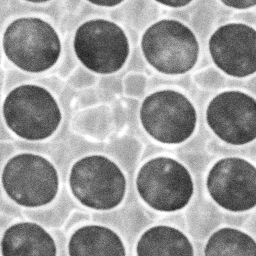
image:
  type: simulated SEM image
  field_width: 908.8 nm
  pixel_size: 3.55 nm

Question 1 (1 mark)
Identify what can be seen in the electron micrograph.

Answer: a regular array of holes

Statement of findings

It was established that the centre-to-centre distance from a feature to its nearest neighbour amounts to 0.24 um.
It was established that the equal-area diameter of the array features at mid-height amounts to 199 nanometres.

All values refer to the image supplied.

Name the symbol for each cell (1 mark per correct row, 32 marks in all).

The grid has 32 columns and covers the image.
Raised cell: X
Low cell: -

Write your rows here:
XXXXXXXXXXXX---XXXXX---XXXXX----
XXXXXXXXXXXXXXXXXXXXXXXXXXXXXXXX
XX----XXXXX--XXXXXXX--XXXXXXXXXX
X------XXX-----XXX------XXX----X
-------XX-------XX------XX------
--------X-------XX-------X------
X-------X-------XX-------X------
X------XXX------XX-------XX-----
XX----XXXXX----XXXX-----XXX-----
XXXXXXXXXXXXXXXXXXXXXXXXXXXXX--X
XXXXXXXXXXXXXXXXXXXXXXXXXXXXXXXX
X-----XXXXXXXXXXXXXX--XXXXXX--XX
X------XXXXXXXXXXX------XX------
-------XXXXXXXXXXX------XX------
--------XXXXXXXXX--------X------
X------XXXXXXXXXXX-------X------
XX-----XXXXXXXXXXX------XXX-----
XXXX-XXXXXXXXXXXXXX----XXXXX----
XXXXXXXXXXXXXXXXXXXXXXXXXXXXXXXX
XX---XXXXXX--XXXXXXXXXXXXXXXXXXX
X-----XXX-----XXXX-----XXXX----X
-------XX------XX-------XX------
-------XX-------X-------XX------
-------XX-------X-------XX------
X------XX------XX-------XX------
XX----XXXX-----XXX-----XXXX-----
XXXXXXXXXXXXXXXXXXXX-XXXXXXXX--X
XXXXXXXXXXXXXXXXXXXXXXXXXXXXXXXX
X----XXXXX---XXXXXX---XXXXXX-XXX
------XXX------XXX-----XXX-----X
-------XX------XX-------XX------
-------XX-------X-------XX------